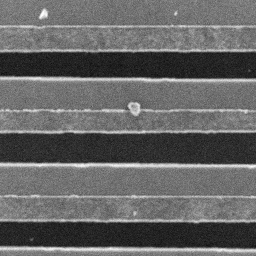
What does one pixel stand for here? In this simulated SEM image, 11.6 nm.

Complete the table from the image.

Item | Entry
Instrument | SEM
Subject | lines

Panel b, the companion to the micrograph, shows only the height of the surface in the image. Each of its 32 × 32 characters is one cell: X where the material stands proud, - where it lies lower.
XXXXXXXXXXXXXXXXXXXXXXXXXXXXXXXX
XXXXXXXXXXXXXXXXXXXXXXXXXXXXXXXX
XXXXXXXXXXXXXXXXXXXXXXXXXXXXXXXX
XXXXXXXXXXXXXXXXXXXXXXXXXXXXXXXX
XXXXXXXXXXXXXXXXXXXXXXXXXXXXXXXX
XXXXXXXXXXXXXXXXXXXXXXXXXXXXXXXX
--------------------------------
--------------------------------
--------------------------------
--------------------------------
XXXXXXXXXXXXXXXXXXXXXXXXXXXXXXXX
XXXXXXXXXXXXXXXXXXXXXXXXXXXXXXXX
XXXXXXXXXXXXXXXXXXXXXXXXXXXXXXXX
XXXXXXXXXXXXXXXXXXXXXXXXXXXXXXXX
XXXXXXXXXXXXXXXXXXXXXXXXXXXXXXXX
XXXXXXXXXXXXXXXXXXXXXXXXXXXXXXXX
--------------------------------
--------------------------------
--------------------------------
--------------------------------
--------------------------------
XXXXXXXXXXXXXXXXXXXXXXXXXXXXXXXX
XXXXXXXXXXXXXXXXXXXXXXXXXXXXXXXX
XXXXXXXXXXXXXXXXXXXXXXXXXXXXXXXX
XXXXXXXXXXXXXXXXXXXXXXXXXXXXXXXX
XXXXXXXXXXXXXXXXXXXXXXXXXXXXXXXX
XXXXXXXXXXXXXXXXXXXXXXXXXXXXXXXX
---XX--XXXXXXXXXXXXXXXXXXXXXXXXX
--------------------------------
--------------------------------
--------------------------------
XXXXXXXXXXXXXXXXXXXXXXXXXXXXXXXX